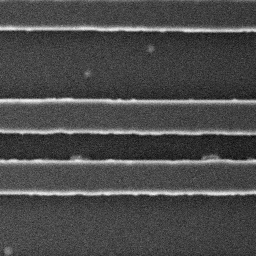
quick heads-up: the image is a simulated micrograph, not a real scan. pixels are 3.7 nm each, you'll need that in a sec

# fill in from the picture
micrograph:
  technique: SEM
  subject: lines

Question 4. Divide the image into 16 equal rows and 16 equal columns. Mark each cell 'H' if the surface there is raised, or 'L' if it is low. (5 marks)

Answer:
HHHHHHHHHHHHHHHH
HHHHHHHHHHHHHHHH
LLLLLLLLLLLLLLLL
LLLLLLLLLLLLLLLL
LLLLLLLLLLLLLLLL
LLLLLLLLLLLLLLLL
HHHHHHHHHHHHHHHH
HHHHHHHHHHHHHHHH
LLLLLLLLLLLLLLLL
LLLLLLLLLLLLLLLL
HHHHHHHHHHHHHHHH
HHHHHHHHHHHHHHHH
LLLLLLLLLLLLLLLL
LLLLLLLLLLLLLLLL
LLLLLLLLLLLLLLLL
LLLLLLLLLLLLLLLL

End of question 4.